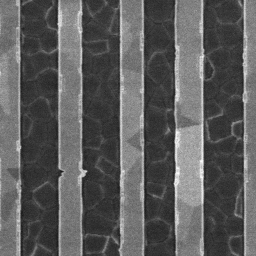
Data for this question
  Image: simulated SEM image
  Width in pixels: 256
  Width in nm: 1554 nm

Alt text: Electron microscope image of one or a few lines or trenches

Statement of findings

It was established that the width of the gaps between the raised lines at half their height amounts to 238 nanometers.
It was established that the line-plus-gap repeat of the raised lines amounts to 358 nm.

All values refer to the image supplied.